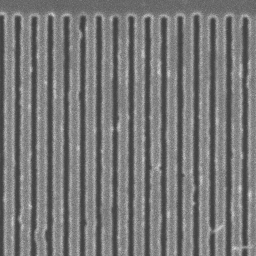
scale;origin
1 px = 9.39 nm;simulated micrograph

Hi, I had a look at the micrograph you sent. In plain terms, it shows parallel lines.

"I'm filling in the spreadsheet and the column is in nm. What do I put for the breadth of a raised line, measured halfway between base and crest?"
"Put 93.9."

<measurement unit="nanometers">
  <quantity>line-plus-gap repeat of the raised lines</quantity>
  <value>152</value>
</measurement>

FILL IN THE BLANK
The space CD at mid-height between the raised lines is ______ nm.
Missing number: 56.3